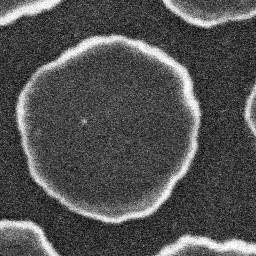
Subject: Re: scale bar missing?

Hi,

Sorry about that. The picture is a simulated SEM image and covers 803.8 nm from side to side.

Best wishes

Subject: raised bodies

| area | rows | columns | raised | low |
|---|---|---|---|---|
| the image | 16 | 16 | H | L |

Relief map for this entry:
HHLLLLLLLLLHHHHH
LLLLLLLLLLLLHLLL
LLLLLLHHLLLLLLLL
LLLLHHHHHHLLLLLL
LLHHHHHHHHHLLLLL
LLHHHHHHHHHHLLLL
LHHHHHHHHHHHLLLL
LHHHHHHHHHHHLLLH
LHHHHHHHHHHHLLLL
LLHHHHHHHHHHLLLL
LLHHHHHHHHHHLLLL
LLLHHHHHHHHLLLLL
LLLLHHHHHHLLLLLL
LLLLLLHHHLLLLLLL
HHLLLLLLLLLLLLLL
HHHLLLLLLLLHHHHH